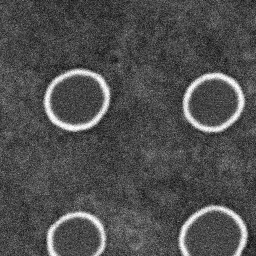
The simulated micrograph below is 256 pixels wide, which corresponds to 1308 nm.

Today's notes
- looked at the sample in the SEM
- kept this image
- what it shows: raised bodies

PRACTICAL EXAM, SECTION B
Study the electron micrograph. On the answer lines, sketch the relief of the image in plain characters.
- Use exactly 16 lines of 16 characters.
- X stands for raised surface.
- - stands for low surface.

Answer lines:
----------------
----------------
----------------
----------------
----------------
---XXXX-----XXX-
---XXXX-----XXX-
---XXX------XXX-
----------------
----------------
----------------
----------------
----------------
----XX------XXX-
---XXX-----XXXX-
---XXX-----XXXX-